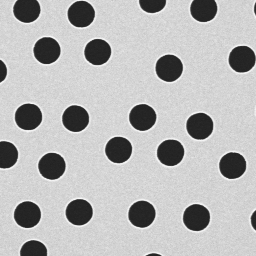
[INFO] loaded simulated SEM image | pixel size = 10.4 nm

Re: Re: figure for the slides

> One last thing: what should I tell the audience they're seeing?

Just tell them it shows a regular array of holes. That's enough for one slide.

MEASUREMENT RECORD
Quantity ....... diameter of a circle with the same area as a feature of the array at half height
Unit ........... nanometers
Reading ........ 280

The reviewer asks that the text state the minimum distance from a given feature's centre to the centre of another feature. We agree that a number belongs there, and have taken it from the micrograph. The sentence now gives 503 nanometers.